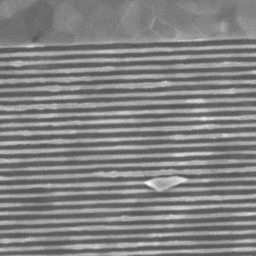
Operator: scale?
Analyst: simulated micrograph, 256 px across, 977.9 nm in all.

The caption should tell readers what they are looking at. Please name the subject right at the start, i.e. parallel lines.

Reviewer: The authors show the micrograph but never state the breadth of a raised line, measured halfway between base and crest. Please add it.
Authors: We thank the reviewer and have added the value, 12.9 nm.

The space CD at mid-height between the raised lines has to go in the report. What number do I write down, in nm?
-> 19.5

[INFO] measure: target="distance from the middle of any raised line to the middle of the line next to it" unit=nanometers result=33.6